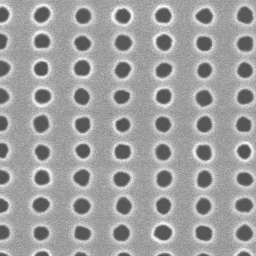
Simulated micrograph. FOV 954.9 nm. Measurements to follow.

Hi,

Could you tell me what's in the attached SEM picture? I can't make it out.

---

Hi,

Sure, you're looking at a regular array of holes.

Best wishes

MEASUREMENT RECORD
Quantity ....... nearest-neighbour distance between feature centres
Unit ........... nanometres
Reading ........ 100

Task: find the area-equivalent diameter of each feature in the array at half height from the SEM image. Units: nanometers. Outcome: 57.5